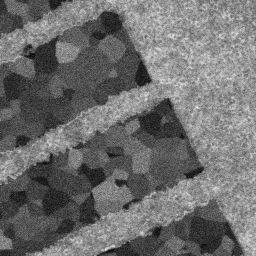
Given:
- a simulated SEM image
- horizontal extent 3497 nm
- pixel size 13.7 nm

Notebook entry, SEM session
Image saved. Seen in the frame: one or a few lines or trenches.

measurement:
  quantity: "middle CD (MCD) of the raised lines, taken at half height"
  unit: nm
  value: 1100